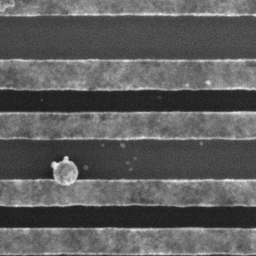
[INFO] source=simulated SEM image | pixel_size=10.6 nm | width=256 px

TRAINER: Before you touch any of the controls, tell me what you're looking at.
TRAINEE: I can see lines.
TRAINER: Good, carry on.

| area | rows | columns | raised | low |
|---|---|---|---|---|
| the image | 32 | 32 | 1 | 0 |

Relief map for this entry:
11111111111111111111111111111111
11111111111111111111111111111111
00000000000000000000000000000000
00000000000000000000000000000000
00000000000000000000000000000000
00000000000000000000000000000000
00000000000000000000000000000000
01100000000110000110000000000111
11111111111111111111111111111111
11111111111111111111111111111111
11111111111111111111111111111111
00000000000000000000000000000000
00000000000000000000000000000000
00000000000000000000000000000000
11111111111111111111111111111111
11111111111111111111111111111111
11111111111111111111111111111111
00000000000000000000000000000000
00000000000000000000000000000000
00000000000000000000000000000000
00000001100000000000000000000000
00000001110000000000000000000000
00001111110000000000000001101000
11111111111111111111111111111111
11111111111111111111111111111111
11111111111111111111111111111111
00000000000000000000000000000000
00000000000000000000000000000000
00000000001001100000001110000000
11111111111111111111111111111111
11111111111111111111111111111111
11111111111111111111111111111111